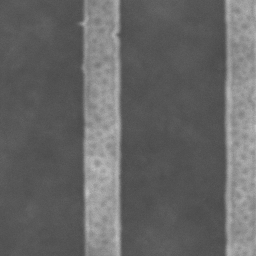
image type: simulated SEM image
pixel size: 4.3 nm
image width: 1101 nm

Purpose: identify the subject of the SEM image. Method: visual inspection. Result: one or a few lines or trenches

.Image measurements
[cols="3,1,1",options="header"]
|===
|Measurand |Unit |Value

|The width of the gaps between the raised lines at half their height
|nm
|475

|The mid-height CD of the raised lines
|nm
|139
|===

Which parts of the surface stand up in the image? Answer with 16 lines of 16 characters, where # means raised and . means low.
.....##.......##
.....##.......##
.....##.......##
.....##.......##
.....##.......##
.....##.......##
.....##.......##
.....##.......##
.....##.......##
.....##.......##
.....##.......##
.....##.......##
.....##.......##
.....##.......##
.....##.......##
.....##.......##